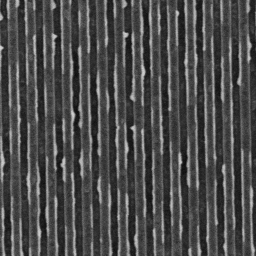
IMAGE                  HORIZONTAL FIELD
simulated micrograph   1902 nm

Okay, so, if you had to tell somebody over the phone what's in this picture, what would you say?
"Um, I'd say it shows parallel lines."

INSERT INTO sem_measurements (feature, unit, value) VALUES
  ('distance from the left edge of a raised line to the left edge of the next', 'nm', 132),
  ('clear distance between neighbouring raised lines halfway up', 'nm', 54.8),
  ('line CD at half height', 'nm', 77.1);